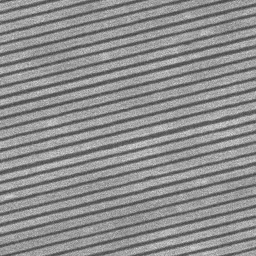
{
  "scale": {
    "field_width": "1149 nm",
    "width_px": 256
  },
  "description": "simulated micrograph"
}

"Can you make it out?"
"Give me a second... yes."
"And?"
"parallel lines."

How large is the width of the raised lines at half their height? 6.82 px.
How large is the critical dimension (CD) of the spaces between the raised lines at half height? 15.3 nm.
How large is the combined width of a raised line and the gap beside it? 46.4 nm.